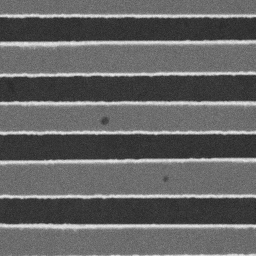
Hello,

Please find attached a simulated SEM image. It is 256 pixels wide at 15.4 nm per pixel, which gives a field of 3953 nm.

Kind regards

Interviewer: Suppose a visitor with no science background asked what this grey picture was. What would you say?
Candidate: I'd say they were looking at lines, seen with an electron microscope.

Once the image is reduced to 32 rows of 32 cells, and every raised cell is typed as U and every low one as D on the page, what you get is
UUUUUUUUUUUUUUUUUUUUUUUUUUUUUUUU
UUUUUUUUUUUUUUUUUUUUUUUUUUUUUUUU
DDDDDDDDDDDDDDDDDDDDDDDDDDDDDDDD
DDDDDDDDDDDDDDDDDDDDDDDDDDDDDDDD
DDDDDDDDDDDDDDDDDDDDDDDDDDDDDDDD
UUUUUUUUUUUUUUUUUUUUUUUUUUUUUUUU
UUUUUUUUUUUUUUUUUUUUUUUUUUUUUUUU
UUUUUUUUUUUUUUUUUUUUUUUUUUUUUUUU
UUUUUUUUUUUUUUUUUUUUUUUUUUUUUUUU
UUUUUUUUUDDDDDUDDDDDDDDDDDDDDDDD
DDDDDDDDDDDDDDDDDDDDDDDDDDDDDDDD
DDDDDDDDDDDDDDDDDDDDDDDDDDDDDDDD
DDDDDDDDDDDDDDDDDDDDDDDDDDDDDDDD
UUUUUUUUUUUUUUUUUUUUUUUUUUUUUUUU
UUUUUUUUUUUUUUUUUUUUUUUUUUUUUUUU
UUUUUUUUUUUUUUUUUUUUUUUUUUUUUUUU
UUUUUUUUUUUUUUUUUUUUUUUUUUUUUUUU
DDDDDDDDDDDDDDDDDDDDDDDDDDDDDDDD
DDDDDDDDDDDDDDDDDDDDDDDDDDDDDDDD
DDDDDDDDDDDDDDDDDDDDDDDDDDDDDDDD
UUUUUUUUUUUUUUUUUUUUUUUUUUUUUUUU
UUUUUUUUUUUUUUUUUUUUUUUUUUUUUUUU
UUUUUUUUUUUUUUUUUUUUUUUUUUUUUUUU
UUUUUUUUUUUUUUUUUUUUUUUUUUUUUUUU
UUUUUUUUUUUUUUUUUUUUUUUUUUUUUUUU
DDDDDDDDDDDDDDDDDDDDDDDDDDDDDDDD
DDDDDDDDDDDDDDDDDDDDDDDDDDDDDDDD
DDDDDDDDDDDDDDDDDDDDDDDDDDDDDDDD
UUUUUUUUUUUUUUUUUUUUUUUUUUUUUUUU
UUUUUUUUUUUUUUUUUUUUUUUUUUUUUUUU
UUUUUUUUUUUUUUUUUUUUUUUUUUUUUUUU
UUUUUUUUUUUUUUUUUUUUUUUUUUUUUUUU